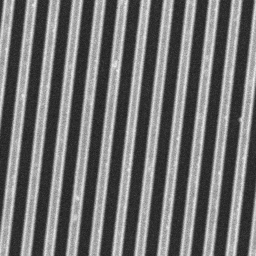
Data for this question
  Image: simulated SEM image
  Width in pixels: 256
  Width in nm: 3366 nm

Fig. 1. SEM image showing parallel lines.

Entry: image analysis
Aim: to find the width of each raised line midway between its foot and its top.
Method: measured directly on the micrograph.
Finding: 8.81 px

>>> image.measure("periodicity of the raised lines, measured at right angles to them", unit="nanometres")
298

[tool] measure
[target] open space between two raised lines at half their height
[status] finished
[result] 13.8 px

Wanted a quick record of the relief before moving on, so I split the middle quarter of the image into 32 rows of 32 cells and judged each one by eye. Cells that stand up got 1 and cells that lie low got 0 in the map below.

01100011000011000011000110000110
11000011000011000110000110000110
11000011000011000110000110000110
11000011000011000110000110000110
11000011000110000110000110001100
11000011000110000110000110001100
11000111000110000110000110001100
11000110000110000110001100001100
11000110000110000110001100001100
11000110000110000110001100001100
10000110000110001100001100001100
10000110000110001100001100001100
10000110001110001100001100001100
10000110001100001100001100011000
10000110001100001100001100011000
10001110001100001100001100011000
10001100001100001100011000011000
10001100001100001100011000011000
10001100001100001100011000011000
00001100001100011000011000011000
00001100001100011000011000011000
00001100011100011000011000111000
00001100011000011000011000110000
00001100011000011000011000110000
00011100011000011000111000110000
00011000011000011000110000110000
00011000011000011000110000110000
00011000011000111000110000110001
00011000011000110000110000110001
00011000011000110000110000110001
00011000110000110000110001110001
00011000110000110000110001100001